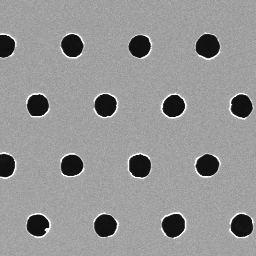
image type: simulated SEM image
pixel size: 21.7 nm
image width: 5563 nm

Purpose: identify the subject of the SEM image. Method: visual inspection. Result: a regular array of holes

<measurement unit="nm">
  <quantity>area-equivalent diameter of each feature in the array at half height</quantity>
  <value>489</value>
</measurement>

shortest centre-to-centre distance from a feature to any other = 1470 nanometers